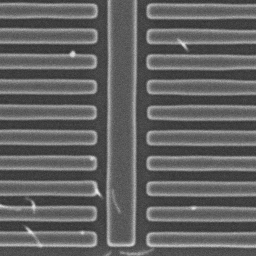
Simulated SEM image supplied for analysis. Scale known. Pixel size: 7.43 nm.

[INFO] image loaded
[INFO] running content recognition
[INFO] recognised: groups of lines, slits or small figures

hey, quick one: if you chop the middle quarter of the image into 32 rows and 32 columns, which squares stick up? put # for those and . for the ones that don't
########...#######...###########
...........#######..............
...........#######..............
...........#######..............
########...#######...###########
########...#######...###########
########...#######...###########
...........#######.............#
...........#######..............
...........#######..............
...........#######..............
########...#######...###########
########...#######...###########
########...#######...###########
...........#######..............
...........#######..............
...........#######..............
########...#######...###########
########...#######...###########
########...#######...###########
...........#######..............
...........#######..............
...........#######..............
########...#######...###########
########...#######...###########
########...#######...###########
...........#######..............
...........#######..............
...........#######..............
.....###...#######..............
########...#######...###########
########...#######...###########